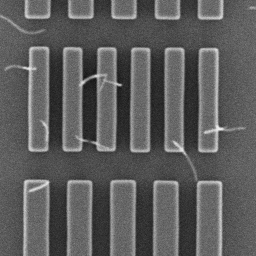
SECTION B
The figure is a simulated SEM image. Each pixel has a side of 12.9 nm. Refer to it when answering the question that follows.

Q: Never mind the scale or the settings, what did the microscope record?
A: groups of lines, slits or small figures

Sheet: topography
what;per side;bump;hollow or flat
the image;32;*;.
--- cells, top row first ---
...***...***..***..***...***....
...***...***..***..***...***....
................................
................................
................................
................................
....**..**..**..***..**..**.....
....**..**..**..***..**..**.....
....**..**..**..***..**..**.....
....**..**..**..***..**..**.....
....**..**..***.***..**..**.....
....**..**..**..***..**..**.....
....**..**..**..***..**..**.....
....**..**..**..***..**..**.....
....**..**..**..***..**..**.....
....**..**..**..***..**..**.....
....**..**..**..***..**..**.....
....**..**..**..***..**..**.....
....**..**..**..***..**..**.....
................................
................................
................................
................................
...***...**...***..***...***....
...***..***...***..***...***....
...***..***...***..***...***....
...***..***...***..***...***....
...***..***...***..***...***....
...***...**...***..***...***....
...***...**...***..***...***....
...***...**...***..***...***....
...***..***...***..***...***....